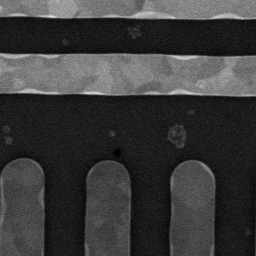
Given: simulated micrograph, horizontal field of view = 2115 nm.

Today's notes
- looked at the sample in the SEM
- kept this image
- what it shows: groups of lines, slits or small figures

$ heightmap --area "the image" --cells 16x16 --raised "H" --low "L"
HHHHHHHHHHHHHHHH
LLLLLLLLLLLLLLLL
LLLLLLLLLLLLLLLL
HHHHHHHHHHHLLLLL
HHHHHHHHHHHHHHHH
HHHHHHHHHHHHHHHH
LLLLLLLLLLLLLLLL
LLLLLLLLLLLLLLLL
LLLLLLLLLLLLLLLL
LLLLLLLLLLLLLLLL
HHLLLLHHLLLHHLLL
HHHLLHHHLLLHHLLL
HHHLLHHHLLLHHLLL
HHHLLHHHLLLHHLLL
HHHLLHHHLLLHHLLL
HHHLLHHHLLLHHLLL